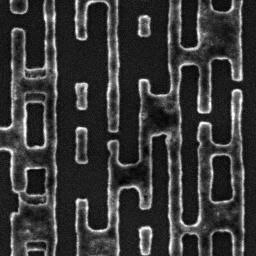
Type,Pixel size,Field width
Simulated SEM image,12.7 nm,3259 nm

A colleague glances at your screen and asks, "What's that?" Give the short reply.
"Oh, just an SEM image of parallel lines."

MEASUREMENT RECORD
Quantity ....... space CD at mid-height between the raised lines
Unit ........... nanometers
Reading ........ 258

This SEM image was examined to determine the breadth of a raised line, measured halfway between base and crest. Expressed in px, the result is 11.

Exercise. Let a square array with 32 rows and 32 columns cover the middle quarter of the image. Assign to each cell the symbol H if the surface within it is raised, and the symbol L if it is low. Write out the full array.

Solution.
LLLLLLLLLLLHHHLLLLLLLLLLLLHHHLLL
LLLLLLLLLLLHHHLLLLLLLLLLLLLHHLLL
LLLLLLLLLLLHHLLLLLLLLLLLLLLHHLLL
LLLLLLLLLLLHHLLLLLLLLLLLLLLHHLLL
LLLLLLLLLLLHHLLLLLLHHLLLLLLHHLLL
LLLHHHLLLLLHHLLLLLLHHLLLLLLHHLLL
LLLHHHLLLLLHHLLLLLLHHLLLLLLHHLLL
LLLHHHLLLLLHHHLLLLLHHHLLLLHHLLLL
LLLLHLLLLLLHHHLLLLLHHHHHHHHHHLLL
LLLHHHLLLLLHHHLLLLLHHHHHHHHHHLLL
LLLHHHLLLLLHHHLLLLLHHHHHHHHHHLLL
LLLLLLLLLLLHHHLLLLLHHHHHHHHHHLLL
LLLLLLLLLLLHHHLLLLLHHHHHHHHHHLLL
LLLLLLLLLLLHHHLLLLLHHHHHHHHHHLLL
LLLLLLLLLLLHHLLLLLLHHHHHHHHHHLLL
LLLLLLLLLLLHHLLLLLLHHHHHHHHHHLLL
LLLHHHLLLLLHHLLLLLLHHHHHHHHHHLLL
LLLHHHLLLLLLLLLLLLLHHHHHLLHHHLLL
LLLHHHLLLLLLLLLLLLLHHHLLLLHHHLLL
LLLHHHLLLLLLHLLLLLLHHHLLLLHHHLLL
LLLHHHLLLLLHHLLLLLLHHHLLLLHHHLLL
LLLHHHLLLLLHHLLLLLLHHHLLLLHHHLLL
LLLHHHLLLLLLHLLLLLLHHHLLLLHHHLLL
LLLHHHLLLLLHHLLLLLLHHHLLLLHHHLLL
LLLHHHLLLLLHHLLLLLLHHHLLLLHHHLLL
LLLLLLLLLLLHHHHHHHHHHHLLLLHHHLLL
LLLLLLLLLLLHHHHHHHHHHHLLLLHHHLLL
LLLLLLLLLLLHHHHHHHHHHHLLLLLHHLLL
LLLLLLLLLLLHHHHHHHHHHHLLLLLHHLLL
LLLLLLLLLLLHHHHHHHHHHHLLLLLHHLLL
LLLLLLLLLLLHHHHHHHHHHHLLLLHHHLLL
LLLLLLLLLLLHHHLLLLLHHHLLLLHHHLLL